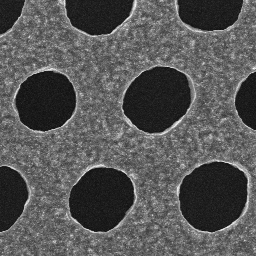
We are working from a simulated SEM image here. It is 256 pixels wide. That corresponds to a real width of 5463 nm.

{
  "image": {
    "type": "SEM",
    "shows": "holes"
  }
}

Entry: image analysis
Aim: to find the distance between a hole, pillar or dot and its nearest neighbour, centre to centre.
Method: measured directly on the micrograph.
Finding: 112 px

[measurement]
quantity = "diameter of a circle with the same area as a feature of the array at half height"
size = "1.41 um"